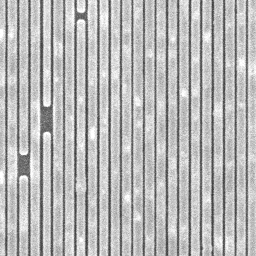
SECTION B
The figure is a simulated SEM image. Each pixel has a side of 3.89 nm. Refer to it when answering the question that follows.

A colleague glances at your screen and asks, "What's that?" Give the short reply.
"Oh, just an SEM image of parallel lines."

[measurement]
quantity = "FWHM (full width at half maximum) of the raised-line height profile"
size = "32.6 nanometres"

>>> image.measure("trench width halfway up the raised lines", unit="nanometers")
10.7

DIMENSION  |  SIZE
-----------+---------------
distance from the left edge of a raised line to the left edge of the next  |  44.5 nm